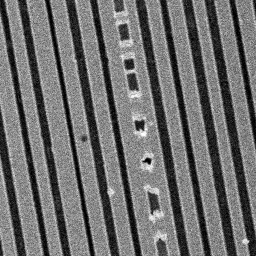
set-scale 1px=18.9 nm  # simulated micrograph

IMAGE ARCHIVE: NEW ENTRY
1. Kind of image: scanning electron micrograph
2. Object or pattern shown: parallel lines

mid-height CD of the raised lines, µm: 0.265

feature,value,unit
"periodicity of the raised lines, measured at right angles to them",432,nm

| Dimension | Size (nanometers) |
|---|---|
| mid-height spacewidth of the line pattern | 176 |